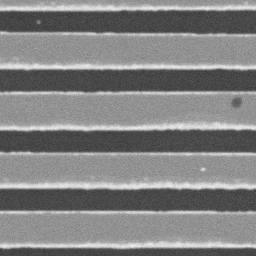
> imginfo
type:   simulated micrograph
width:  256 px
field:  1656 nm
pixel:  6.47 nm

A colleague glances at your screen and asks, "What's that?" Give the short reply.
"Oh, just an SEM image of lines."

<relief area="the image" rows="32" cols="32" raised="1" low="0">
11111111111111111111111111111111
00000000000000000000000000000000
00000000000000000000000000000000
00000000000000000000000000000000
11111111111111111111111111111111
11111111111111111111111111111111
11111111111111111111111111111111
11111111111111111111111111111111
11111111111111111101111111111111
00000000000000000000000000000000
00000000000000000000000000000000
00000000000000000000000000000000
11111111111111111111111111111111
11111111111111111111111111111111
11111111111111111111111111111111
11111111111111111111111111111111
00000000000000000000000000000000
00000000000000000000000000000000
00000000000000000000000000000000
11111111111111111111111111111111
11111111111111111111111111111111
11111111111111111111111111111111
11111111111111111111111111111111
11111111111111111111011111111111
00000000000000000000000000000000
00000000000000000000000000000000
11111111111111111111111111100001
11111111111111111111111111111111
11111111111111111111111111111111
11111111111111111111111111111111
11111111111111111111111111111111
00000000000000000000000000000000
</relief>